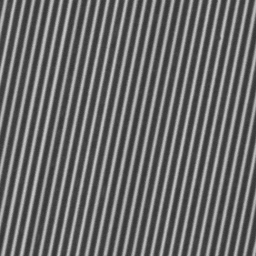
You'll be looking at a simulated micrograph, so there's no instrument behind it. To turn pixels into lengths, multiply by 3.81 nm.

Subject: parallel lines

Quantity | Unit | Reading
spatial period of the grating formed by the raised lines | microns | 0.0348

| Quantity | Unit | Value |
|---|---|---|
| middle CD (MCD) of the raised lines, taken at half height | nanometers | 10.7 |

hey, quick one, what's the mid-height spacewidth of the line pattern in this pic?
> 25.8 nanometres